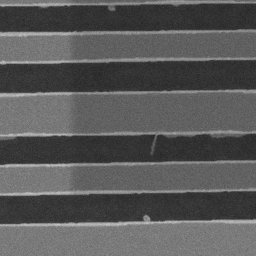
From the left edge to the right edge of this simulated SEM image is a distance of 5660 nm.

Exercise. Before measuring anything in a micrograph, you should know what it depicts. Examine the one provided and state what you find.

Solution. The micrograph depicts lines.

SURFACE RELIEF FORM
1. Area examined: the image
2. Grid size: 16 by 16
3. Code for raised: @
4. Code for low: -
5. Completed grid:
----------------
----------------
@@@@@@@@@@@@@@@@
@@@@@@@@@@@@@@@@
----------------
----------------
@@@@@@@@@@@@@@@@
@@@@@@@@@@@@@@@@
----------------
----------------
@@@@@@@@@@@@@@@@
@@@@@@@@@@@@@@@@
----------------
----------------
@@@@@@@@@@@@@@@@
@@@@@@@@@@@@@@@@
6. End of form